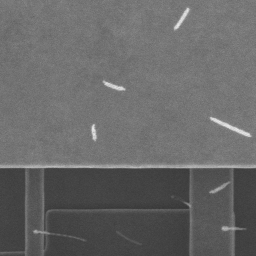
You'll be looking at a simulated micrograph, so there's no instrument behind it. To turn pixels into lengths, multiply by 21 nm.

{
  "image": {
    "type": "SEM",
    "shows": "wiring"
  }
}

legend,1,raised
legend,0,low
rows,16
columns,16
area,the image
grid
1111111111111111
1111111111111111
1111111111111111
1111111111111111
1111111111111111
1111111111111111
1111111111111111
1111111111111111
1111111111111111
1111111111111111
0000000000000000
0000000000000000
0000000000000000
0000000000000000
0000000000000000
0000000000000000